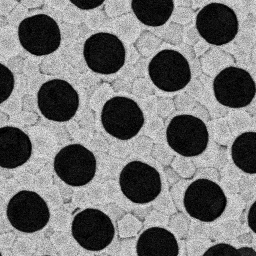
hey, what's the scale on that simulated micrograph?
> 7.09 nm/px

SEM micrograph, a regular array of holes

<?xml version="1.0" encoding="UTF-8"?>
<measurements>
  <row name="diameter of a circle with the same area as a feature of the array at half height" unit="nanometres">299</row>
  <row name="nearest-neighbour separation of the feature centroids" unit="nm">472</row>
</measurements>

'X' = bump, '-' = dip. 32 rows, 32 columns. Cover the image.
XXXXXXXXX----XXX------XXXX--XXXX
XXXXXXXXXXXXXXXXX-----XXX----XXX
XXX----XXXXXXXXXX----XXXX-----XX
XX-----XXXXXXXXXXXXXXXXXX-----XX
XX------XXX---XXXXXXXXXXX----XXX
XXX----XXXX----XXXXXXXXXXX--XXXX
XXXX---XXX------XXXX--XXXXXXXXXX
XXXXXXXXXXX-----XXX----XXXXXXXXX
-XXXXXXXXXX----XXXX-----XXXX--XX
--XXXXXXXXXXXXXXXXX-----XXX----X
--XXX----XXXXXXXXXX----XXXX-----
--XXX-----XXXXXXXXXXXXXXXXX-----
-XXXX-----XXXX---XXXXXXXXXX-----
XXXXX-----XXX----XXXXXXXXXXXX-XX
XXXXX----XXXX-----XXXX--XXXXXXXX
XXXXXXXXXXXXX-----XXX-----XXXXXX
---XXXXXXXXXX----XXXX-----XXXXXX
----XXXXXXXXXXXXXXXXX-----XXX---
----XXXX---XXXXXXXXXX-----XXX---
----XXX-----XXXXXXXXXXX-XXXXX---
---XXXX-----XXXX--XXXXXXXXXXX---
XXXXXXX-----XXX-----XXXXXXXXXXX-
XXXXXXXX---XXXX-----XXXXX-XXXXXX
XXXXXXXXXXXXXXX-----XXX-----XXXX
XX---XXXXXXXXXXX----XXX-----XXXX
X-----XXXXXXXXXXXXXXXXX-----XXXX
X-----XXXX---XXXXXXXXXX-----XXX-
X-----XXX-----XXXXXXXXXXX--XXXX-
XX---XXXX-----XXXXX-XXXXXXXXXXX-
XXXXXXXXX-----XXXX----XXXXXXXXXX
XXXXXXXXXX----XXX-----XXXXX-XXXX
XXXXXXXXXXXXXXXXX-----XXXX------